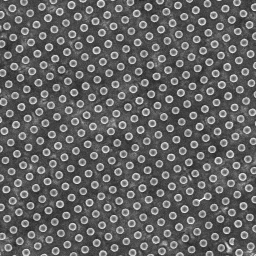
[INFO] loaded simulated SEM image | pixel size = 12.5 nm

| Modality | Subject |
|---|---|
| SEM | a regular array of raised bodies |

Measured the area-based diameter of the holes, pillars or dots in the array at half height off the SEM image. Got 0.0915 um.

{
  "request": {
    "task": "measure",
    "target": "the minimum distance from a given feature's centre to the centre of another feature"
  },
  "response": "161 nanometres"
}